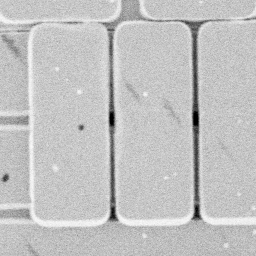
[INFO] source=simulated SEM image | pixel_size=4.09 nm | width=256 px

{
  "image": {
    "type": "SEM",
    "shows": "wiring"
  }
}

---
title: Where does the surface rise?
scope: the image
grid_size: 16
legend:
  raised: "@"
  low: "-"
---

@@@@@@@--@@@@@@@
--@@@@@-@@@@@@@@
--@@@@@@@@@@@@@@
--@@@@@@@@@@@@@@
--@@@@@@@@@@@@@@
--@@@@@@@@@@@@@@
--@@@@@@@@@@@@@@
--@@@@@@@@@@@@@@
--@@@@@@@@@@@@@@
--@@@@@@@@@@@@@@
--@@@@@@@@@@@@@@
--@@@@@@@@@@@@@@
--@@@@@@@@@@@@@@
--@@@@@@@@@@-@@@
----------------
----------------